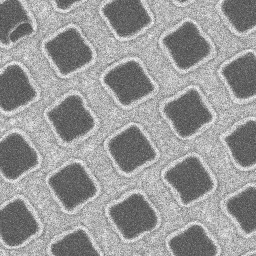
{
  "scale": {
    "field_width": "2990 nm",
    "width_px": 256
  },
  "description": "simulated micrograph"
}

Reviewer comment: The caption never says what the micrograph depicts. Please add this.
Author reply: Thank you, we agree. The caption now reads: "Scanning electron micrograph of a regular array of raised bodies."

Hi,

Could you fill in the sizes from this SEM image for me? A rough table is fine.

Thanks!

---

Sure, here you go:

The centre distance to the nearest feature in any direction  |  777 nm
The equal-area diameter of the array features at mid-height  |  562 nanometers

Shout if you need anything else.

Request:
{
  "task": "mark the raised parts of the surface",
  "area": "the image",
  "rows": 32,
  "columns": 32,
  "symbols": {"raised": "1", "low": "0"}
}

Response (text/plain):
11100001110001111100001000011111
11110000000001111110000000001111
11110000000001111110000100001111
11000000110000111100001110000111
10000011111000011000111111000000
10000111111000000000111111100000
00000011111100000000011111100001
00000011111100001000011111000111
11100001111000111100001100001111
11110000100001111110000000001111
11110000000001111110000000001111
11111000000000111111000110000111
11110001111000111100011111000110
11100011111000000000111111000000
00000011111100000000111111100000
00000011111100001000011111000011
01100001111000011100001110001111
11110001110001111110000000001111
11110000000001111110000000001111
11111000000000111111000110000111
11111000110000111110011111000111
11110001111000011000111111000000
01000011111100000000111111100000
00000011111100000000011111100011
00000001111100001100001111000111
01110001111000111110000100001111
11110000100001111111000000001111
11111000000000111111000000000111
11111000000000111111000111000011
11110001111000011100011111000000
11100011111100000000011111100000
00000011111110000000011111100000